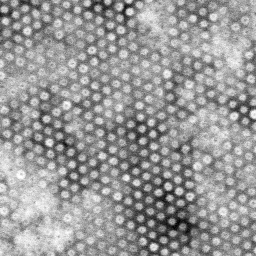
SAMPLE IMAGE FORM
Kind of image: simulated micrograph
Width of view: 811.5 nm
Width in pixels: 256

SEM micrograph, a regular array of raised bodies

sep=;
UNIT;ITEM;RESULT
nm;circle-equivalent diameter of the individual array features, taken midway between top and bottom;18.6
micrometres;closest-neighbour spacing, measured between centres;0.0364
